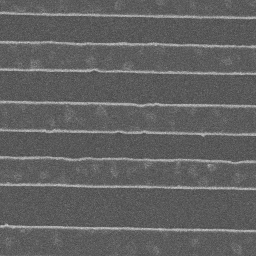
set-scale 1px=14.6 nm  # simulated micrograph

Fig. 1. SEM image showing one or a few lines or trenches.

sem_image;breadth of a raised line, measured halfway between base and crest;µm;0.409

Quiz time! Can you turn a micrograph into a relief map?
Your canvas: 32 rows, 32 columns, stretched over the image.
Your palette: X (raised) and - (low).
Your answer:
XXXXXXXXXXXXXXXXXXXXXXXXXXXXXXXX
XXXXXXXXXXXXXXXXXXXXXXXXXXXXXXXX
--------------------------------
--------------------------------
--------------------------------
XXXXXXXXXXXX---XX---------------
XXXXXXXXXXXXXXXXXXXXXXXXXXXXXXXX
XXXXXXXXXXXXXXXXXXXXXXXXXXXXXXXX
XXXXXXXXXXXXXXXXXXXXXXXXXXXXXXXX
--------------------------------
--------------------------------
--------------------------------
--------------------------------
XXXXXXXXXXXXXXXXXXXXXXXXXXXXXXXX
XXXXXXXXXXXXXXXXXXXXXXXXXXXXXXXX
XXXXXXXXXXXXXXXXXXXXXXXXXXXXXXXX
-------------XXXXXXXXXXXXXXXXXXX
--------------------------------
--------------------------------
--------------------------------
XXXXXXXXXXXXXXXXXXXXXXXXXXXXXXXX
XXXXXXXXXXXXXXXXXXXXXXXXXXXXXXXX
XXXXXXXXXXXXXXXXXXXXXXXXXXXXXXXX
-------------------------XXXXXXX
--------------------------------
--------------------------------
--------------------------------
--------------------------------
XXXXXXXX------------------------
XXXXXXXXXXXXXXXXXXXXXXXXXXXXXXXX
XXXXXXXXXXXXXXXXXXXXXXXXXXXXXXXX
XXXXXXXXXXXXXXXXXXXXXXXXXXXXXXXX